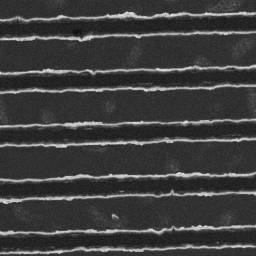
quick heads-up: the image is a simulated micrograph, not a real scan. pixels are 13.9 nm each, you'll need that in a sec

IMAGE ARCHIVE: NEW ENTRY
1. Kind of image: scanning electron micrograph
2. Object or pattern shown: parallel lines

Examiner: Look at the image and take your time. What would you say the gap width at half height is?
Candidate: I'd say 255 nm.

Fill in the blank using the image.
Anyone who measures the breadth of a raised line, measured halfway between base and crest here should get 485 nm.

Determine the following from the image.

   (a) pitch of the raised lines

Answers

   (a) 744 nm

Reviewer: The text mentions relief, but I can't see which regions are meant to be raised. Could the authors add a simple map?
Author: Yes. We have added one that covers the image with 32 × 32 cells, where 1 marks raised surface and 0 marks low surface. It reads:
11111111111111111111111111111111
11111111111111111111111111111111
10000000000000000000000000000000
00000000000000000000000000000000
00000000000000111011111111111111
11111111111111111111111111111111
11111111111111111111111111111111
11111111111111111111111111111111
11111111111111111111111101000010
00000000000000000000000000000000
00000000000000000000000000000000
01111111111111111111111111111111
11111111111111111111111111111111
11111111111111111111111111111111
11111111111111111111111111111111
11111111111111100000000000000000
00000000000000000000000000000000
00000000000000000000000000000111
11111111111111111111111111111111
11111111111111111111111111111111
11111111111111111111111111111111
11111111111111111111111111111111
01111000000000000000000000000000
00000000000000000000000000000000
00000000000000011110111111111111
11111111111111111111111111111111
11111111111111111111111111111111
11111111111111111111111111111111
11111111111111111111111111110000
00000000000000000000000000000000
00000000000000000000000000000000
00000011111111111111111111111111